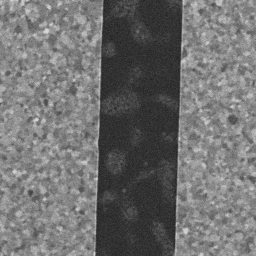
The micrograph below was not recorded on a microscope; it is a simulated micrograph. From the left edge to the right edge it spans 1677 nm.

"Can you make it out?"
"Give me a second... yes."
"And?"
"one or a few lines or trenches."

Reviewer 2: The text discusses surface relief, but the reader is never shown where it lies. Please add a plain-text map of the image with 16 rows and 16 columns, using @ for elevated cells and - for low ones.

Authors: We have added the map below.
@@@@@@-----@@@@@
@@@@@@-----@@@@@
@@@@@@-----@@@@@
@@@@@@-----@@@@@
@@@@@@-----@@@@@
@@@@@@-----@@@@@
@@@@@@-----@@@@@
@@@@@@-----@@@@@
@@@@@@-----@@@@@
@@@@@@-----@@@@@
@@@@@@-----@@@@@
@@@@@@-----@@@@@
@@@@@@-----@@@@@
@@@@@@-----@@@@@
@@@@@@-----@@@@@
@@@@@@-----@@@@@